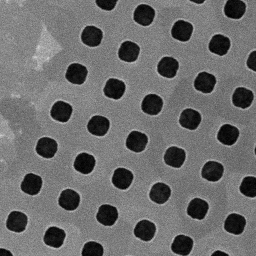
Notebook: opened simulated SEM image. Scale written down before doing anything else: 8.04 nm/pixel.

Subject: a regular array of holes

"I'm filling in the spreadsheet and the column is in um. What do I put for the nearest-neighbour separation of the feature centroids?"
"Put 0.319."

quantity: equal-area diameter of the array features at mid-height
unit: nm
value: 179